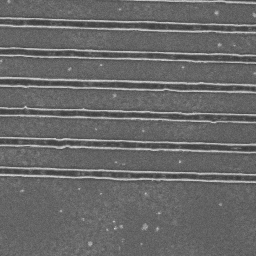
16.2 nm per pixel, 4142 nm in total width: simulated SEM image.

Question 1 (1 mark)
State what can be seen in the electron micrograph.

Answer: parallel lines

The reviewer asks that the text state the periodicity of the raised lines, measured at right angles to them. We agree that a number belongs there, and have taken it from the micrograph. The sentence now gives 483 nanometers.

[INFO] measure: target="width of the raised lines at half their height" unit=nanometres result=119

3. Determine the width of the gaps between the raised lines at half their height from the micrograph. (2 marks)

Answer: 0.354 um